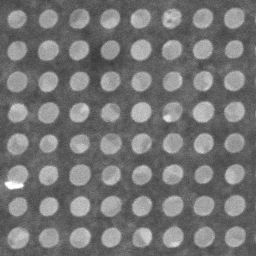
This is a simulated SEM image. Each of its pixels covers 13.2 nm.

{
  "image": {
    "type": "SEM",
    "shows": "a regular array of raised bodies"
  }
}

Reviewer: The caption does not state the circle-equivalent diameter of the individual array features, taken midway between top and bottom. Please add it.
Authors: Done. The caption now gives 246 nanometres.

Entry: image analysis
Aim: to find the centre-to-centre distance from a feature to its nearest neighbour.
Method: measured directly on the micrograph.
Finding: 406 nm